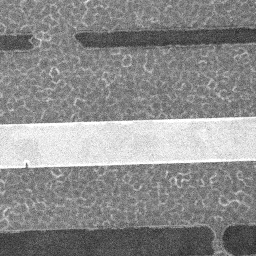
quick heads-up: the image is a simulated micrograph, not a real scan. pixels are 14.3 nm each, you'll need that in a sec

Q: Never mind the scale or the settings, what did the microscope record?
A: one or a few lines or trenches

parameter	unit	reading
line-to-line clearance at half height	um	0.896